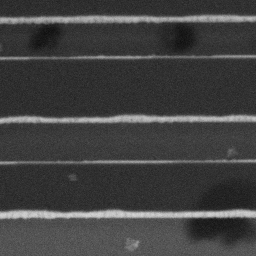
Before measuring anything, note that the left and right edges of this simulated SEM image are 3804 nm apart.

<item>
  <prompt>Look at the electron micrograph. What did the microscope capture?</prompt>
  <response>lines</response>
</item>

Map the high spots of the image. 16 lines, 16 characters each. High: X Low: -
XXXXXXXXXXXXXXXX
----------------
----------------
----------------
XXXXXXXXXXXXXXXX
XXXXXXXXXXXXXXXX
XXXXXXXXXXXXXXXX
XXXXXXXXXXXXXXXX
----------------
----------------
XXXXXXXXXXXXXXXX
XXXXXXXXXXXXXXXX
XXXXXXXXXXXXXXXX
XXXXXXXXXXXXXX--
----------------
----------------